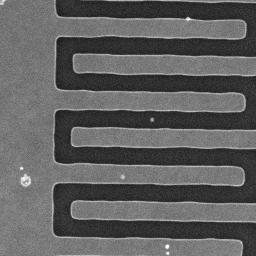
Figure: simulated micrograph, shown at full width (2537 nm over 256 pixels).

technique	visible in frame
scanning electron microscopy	groups of lines, slits or small figures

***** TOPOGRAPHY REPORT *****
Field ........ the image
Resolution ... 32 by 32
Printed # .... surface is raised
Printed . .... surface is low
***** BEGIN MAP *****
#######.........................
#######.........................
#########################.......
###############################.
#############.#################.
#######.........................
#######.........................
#######..#######################
#######..#######################
#######.........................
#######.........................
############.#..................
###############################.
###############################.
#######.........................
#######.........................
#######..#######################
#######..#######################
#######..................##.####
#######.........................
########.###....................
##############################..
###############################.
#######.........................
#######.........................
#######..#######################
#######..#######################
#######..............###########
#######.........................
#######.........................
##############################..
##############################..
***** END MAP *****